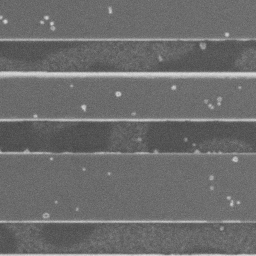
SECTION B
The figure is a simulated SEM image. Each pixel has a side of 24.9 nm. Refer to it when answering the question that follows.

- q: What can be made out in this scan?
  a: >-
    lines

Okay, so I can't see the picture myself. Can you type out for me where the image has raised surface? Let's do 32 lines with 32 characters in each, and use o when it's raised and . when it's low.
oooooooooooooooooooooooooooooooo
oooooooooooooooooooooooooooooooo
oooooooooooooooooooooooooooooooo
oooooooooooooooooooooooooooooooo
oooooooooooooooooooooooooooooooo
................................
................................
................................
................................
oooooooooooooooooooooooooooooooo
oooooooooooooooooooooooooooooooo
oooooooooooooooooooooooooooooooo
oooooooooooooooooooooooooooooooo
oooooooooooooooooooooooooooooooo
oooooooooooooooooooooooooooooooo
................................
................................
................................
................................
oooooooooooooooooooooooooooooooo
oooooooooooooooooooooooooooooooo
oooooooooooooooooooooooooooooooo
oooooooooooooooooooooooooooooooo
oooooooooooooooooooooooooooooooo
oooooooooooooooooooooooooooooooo
oooooooooooooooooooooooooooooooo
oooooooooooooooooooooooooooooooo
oooooooooooooooooooooooooooooooo
................................
................................
................................
................................